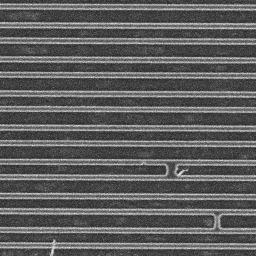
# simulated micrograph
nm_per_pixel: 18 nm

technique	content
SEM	parallel lines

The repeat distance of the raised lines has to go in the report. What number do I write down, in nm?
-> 308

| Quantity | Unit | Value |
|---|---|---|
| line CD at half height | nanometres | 72.2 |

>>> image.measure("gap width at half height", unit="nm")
216